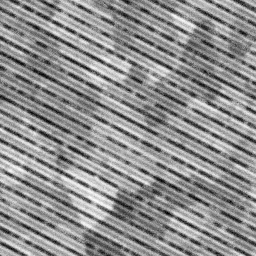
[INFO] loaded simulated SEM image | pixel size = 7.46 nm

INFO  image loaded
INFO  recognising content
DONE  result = parallel lines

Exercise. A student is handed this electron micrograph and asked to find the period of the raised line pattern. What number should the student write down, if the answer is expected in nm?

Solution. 96.8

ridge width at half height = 50.4 nm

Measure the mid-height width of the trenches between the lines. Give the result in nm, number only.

43.8